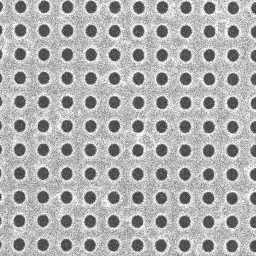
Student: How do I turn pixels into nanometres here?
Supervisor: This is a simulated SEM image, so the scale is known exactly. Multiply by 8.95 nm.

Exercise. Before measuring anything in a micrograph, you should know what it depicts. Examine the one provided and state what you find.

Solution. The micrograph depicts a regular array of holes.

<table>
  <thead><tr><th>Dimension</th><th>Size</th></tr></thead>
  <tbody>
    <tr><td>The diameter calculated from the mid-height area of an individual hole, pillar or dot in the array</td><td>110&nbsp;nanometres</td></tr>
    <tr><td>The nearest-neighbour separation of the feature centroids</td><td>0.211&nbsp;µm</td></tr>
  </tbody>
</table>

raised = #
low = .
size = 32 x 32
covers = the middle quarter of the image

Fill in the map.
################################
################################
..####..###...####..###...####.#
..###...###...###...###...###...
..###...###...###...###...###...
################################
################################
################################
..####..###...###...###...###..#
..###...###...###...###...###...
..###...###...###...###...###...
################################
################################
################################
..####..###...###...###...###..#
..###...###...###...###...###...
..###...###...###...###...###...
################################
################################
################################
..###...###...###...###...###..#
..###...###...###...###...###...
..###...###...###...###...###..#
################################
################################
################################
..###...###...###...###...###..#
..###...###...###...###...###...
..###...###...###...###...###..#
################################
################################
################################